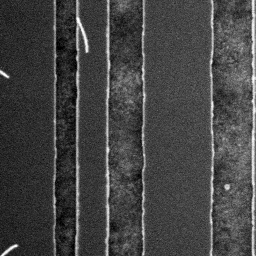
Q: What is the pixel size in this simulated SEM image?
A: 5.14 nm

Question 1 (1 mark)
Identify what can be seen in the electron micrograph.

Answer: lines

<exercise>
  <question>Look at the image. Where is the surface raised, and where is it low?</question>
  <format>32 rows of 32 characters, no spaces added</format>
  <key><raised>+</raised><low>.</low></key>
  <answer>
+++++++...++++....+++++++++.....
+++++++...++++....+++++++++.....
+++++++...++++....+++++++++.....
+++++++...++++....+++++++++.....
+++++++...++++....+++++++++.....
+++++++...++++....+++++++++.....
+++++++...++++....+++++++++.....
+++++++...++++....++++++++......
+++++++...++++....++++++++......
+++++++...++++....++++++++......
+++++++...++++....++++++++......
+++++++...++++....++++++++......
+++++++...++++....+++++++++.....
+++++++...+++.....+++++++++.....
+++++++...+++.....+++++++++.....
+++++++...+++.....++++++++......
+++++++...+++.....+++++++++.....
+++++++...+++.....+++++++++.....
+++++++...++++....+++++++++.....
+++++++...+++.....+++++++++.....
+++++++...+++.....+++++++++.....
+++++++...++++....+++++++++.....
+++++++...++++....+++++++++.....
+++++++...++++....+++++++++.....
+++++++...++++....+++++++++.....
+++++++...++++....+++++++++.....
+++++++...++++....++++++++......
+++++++...++++....++++++++......
+++++++...++++....++++++++......
+++++++..+++++....++++++++......
+++++++..++++.....++++++++......
+++++++..++++.....++++++++......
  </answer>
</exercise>